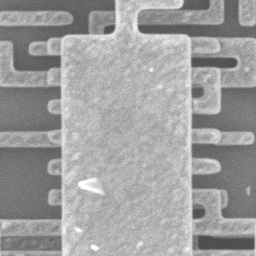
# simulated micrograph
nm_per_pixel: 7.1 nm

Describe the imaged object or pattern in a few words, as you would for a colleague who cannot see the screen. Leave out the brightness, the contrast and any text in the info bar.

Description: wiring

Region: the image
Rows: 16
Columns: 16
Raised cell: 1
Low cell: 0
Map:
0000000111100000
0000000110000000
0000111111110000
0000111111110000
0000111111110000
0000111111110000
0000111111110000
0000111111110000
0000111111110000
0000111111110000
0000111111110000
0000111111110000
0000111111110000
0000111111110000
0000111111110000
0000111111110000